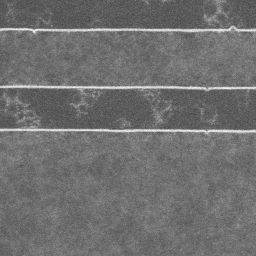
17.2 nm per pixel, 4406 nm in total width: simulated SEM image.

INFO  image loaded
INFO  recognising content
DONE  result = one or a few lines or trenches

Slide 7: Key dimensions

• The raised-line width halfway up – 742 nm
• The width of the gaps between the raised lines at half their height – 0.99 um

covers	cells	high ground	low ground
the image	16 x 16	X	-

XXXXXXXXXXXXXXXX
XXXXXXXXXXXXXXXX
----------------
----------------
----------------
XXXXX---XXXX---X
XXXXXXXXXXXXXXXX
XXXXXXXXXXXXXXXX
----------------
----------------
----------------
----------------
----------------
----------------
----------------
----------------